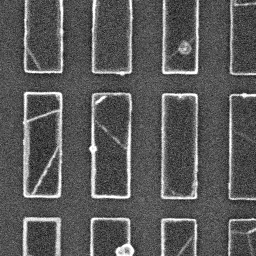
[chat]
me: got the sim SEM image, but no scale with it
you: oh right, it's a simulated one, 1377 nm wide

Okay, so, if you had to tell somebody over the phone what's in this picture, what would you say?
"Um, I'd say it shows wiring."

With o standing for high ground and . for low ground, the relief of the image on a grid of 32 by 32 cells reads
...ooooo....oooo....ooooo....ooo
...ooooo....oooo....ooooo....ooo
...ooooo....oooo....ooooo....ooo
...ooooo....oooo.....oooo....ooo
...ooooo....oooo....ooooo....ooo
...ooooo....oooo....ooooo....ooo
...ooooo....oooo....ooooo....ooo
...ooooo....oooo....ooooo....ooo
...ooooo....oooo....ooooo....ooo
................................
................................
................................
...ooooo....oooo....ooooo....ooo
...ooooo....oooo....ooooo....ooo
...ooooo....oooo....ooooo....ooo
...ooooo....oooo....ooooo....ooo
...ooooo....oooo....ooooo....ooo
...ooooo....oooo....ooooo....ooo
...ooooo...ooooo....ooooo....ooo
...ooooo....oooo....ooooo....ooo
...ooooo....oooo....ooooo....ooo
...oooo.....oooo....ooooo....ooo
...oooo.....oooo....ooooo....ooo
...oooo.....oooo....ooooo....ooo
............oooo.....ooo.....ooo
................................
................................
...oooo.....oooo.....ooo......oo
...oooo....ooooo....oooo.....ooo
...oooo....ooooo....oooo.....ooo
...oooo....ooooo....oooo.....ooo
...oooo....oooooo...oooo.....ooo